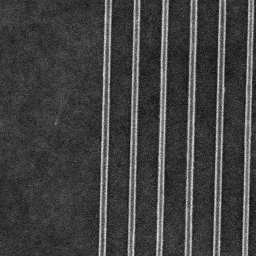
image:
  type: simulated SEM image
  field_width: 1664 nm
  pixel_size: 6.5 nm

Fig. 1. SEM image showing parallel lines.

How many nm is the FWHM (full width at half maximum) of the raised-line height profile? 34.9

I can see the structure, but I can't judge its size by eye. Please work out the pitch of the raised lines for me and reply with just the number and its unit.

0.185 microns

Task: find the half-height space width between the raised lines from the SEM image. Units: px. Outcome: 23.6